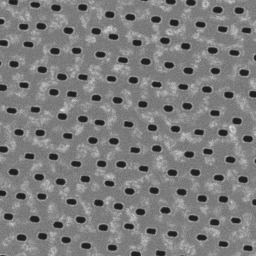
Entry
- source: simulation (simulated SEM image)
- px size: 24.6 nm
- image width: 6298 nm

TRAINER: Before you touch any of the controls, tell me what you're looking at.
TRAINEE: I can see a regular array of holes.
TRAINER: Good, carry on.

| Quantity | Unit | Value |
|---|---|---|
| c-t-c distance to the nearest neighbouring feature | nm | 513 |